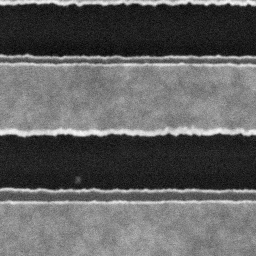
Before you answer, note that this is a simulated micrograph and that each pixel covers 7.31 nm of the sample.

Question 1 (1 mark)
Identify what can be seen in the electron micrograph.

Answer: lines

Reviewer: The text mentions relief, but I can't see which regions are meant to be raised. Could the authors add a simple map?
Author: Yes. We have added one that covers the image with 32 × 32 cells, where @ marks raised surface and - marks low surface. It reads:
-------@@@@--@-----@-@---@---@@@
--------------------------------
--------------------------------
--------------------------------
--------------------------------
--------------------------------
--------------------------------
@@@@@@@@@@@@@@@@@@@@@@@@@@@@@@@@
@@@@@@@@@@@@@@@@@@@@@@@@@@@@@@@@
@@@@@@@@@@@@@@@@@@@@@@@@@@@@@@@@
@@@@@@@@@@@@@@@@@@@@@@@@@@@@@@@@
@@@@@@@@@@@@@@@@@@@@@@@@@@@@@@@@
@@@@@@@@@@@@@@@@@@@@@@@@@@@@@@@@
@@@@@@@@@@@@@@@@@@@@@@@@@@@@@@@@
@@@@@@@@@@@@@@@@@@@@@@@@@@@@@@@@
@@@@@@@@@@@@@@@@@@@@@@@@@@@@@@@@
@@@@@@@@@@@@@@@@@@@@@@@@@@@@@@@@
--------------------------------
--------------------------------
--------------------------------
--------------------------------
--------------------------------
--------------------------------
--------------------------------
@@@@@@@@@@@@@@@@@@@@@@@@@@@@@@@@
@@@@@@@@@@@@@@@@@@@@@@@@@@@@@@@@
@@@@@@@@@@@@@@@@@@@@@@@@@@@@@@@@
@@@@@@@@@@@@@@@@@@@@@@@@@@@@@@@@
@@@@@@@@@@@@@@@@@@@@@@@@@@@@@@@@
@@@@@@@@@@@@@@@@@@@@@@@@@@@@@@@@
@@@@@@@@@@@@@@@@@@@@@@@@@@@@@@@@
@@@@@@@@@@@@@@@@@@@@@@@@@@@@@@@@